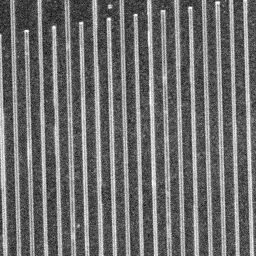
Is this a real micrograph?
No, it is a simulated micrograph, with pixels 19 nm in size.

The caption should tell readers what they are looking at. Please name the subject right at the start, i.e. parallel lines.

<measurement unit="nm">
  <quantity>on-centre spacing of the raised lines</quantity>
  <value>260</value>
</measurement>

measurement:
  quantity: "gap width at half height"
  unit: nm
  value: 195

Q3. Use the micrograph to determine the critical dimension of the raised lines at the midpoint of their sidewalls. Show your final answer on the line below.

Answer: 57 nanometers